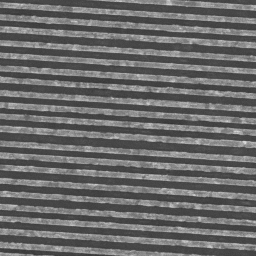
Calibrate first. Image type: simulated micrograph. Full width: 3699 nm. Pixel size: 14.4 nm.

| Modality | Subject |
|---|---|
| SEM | parallel lines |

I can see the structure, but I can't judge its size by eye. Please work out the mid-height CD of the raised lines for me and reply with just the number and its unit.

68.5 nm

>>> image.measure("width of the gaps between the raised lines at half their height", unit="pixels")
7.61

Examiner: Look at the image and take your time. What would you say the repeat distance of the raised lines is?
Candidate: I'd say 182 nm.